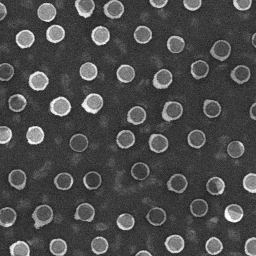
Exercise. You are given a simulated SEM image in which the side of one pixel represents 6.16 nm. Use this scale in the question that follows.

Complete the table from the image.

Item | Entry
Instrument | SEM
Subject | a regular array of raised bodies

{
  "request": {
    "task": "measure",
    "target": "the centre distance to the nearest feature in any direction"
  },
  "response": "201 nm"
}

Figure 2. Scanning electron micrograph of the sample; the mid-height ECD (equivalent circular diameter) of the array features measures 112 nm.